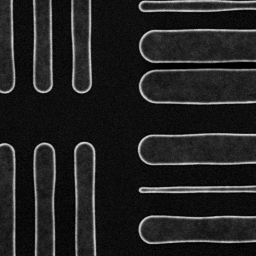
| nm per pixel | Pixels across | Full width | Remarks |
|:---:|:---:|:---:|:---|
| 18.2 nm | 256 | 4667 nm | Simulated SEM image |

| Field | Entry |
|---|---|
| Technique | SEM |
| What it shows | groups of lines, slits or small figures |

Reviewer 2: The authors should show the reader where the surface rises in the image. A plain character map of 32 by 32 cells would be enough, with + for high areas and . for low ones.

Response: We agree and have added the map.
+...++...++.......++++++++++++++
+...++...++.....................
+...++...++.....................
+...++...++.....................
++..++...++.......++++++++++++++
++..++...++.......++++++++++++++
++..++...++.......++++++++++++++
++..++...++.......++++++++++++++
++..++...++.....................
++..++...++.......++++++++++++++
++..++...++.......++++++++++++++
..................++++++++++++++
..................++++++++++++++
................................
................................
................................
................................
..................++++++++++++++
++...++...++.....+++++++++++++++
++..+++..+++......++++++++++++++
++..+++..+++....................
++..+++..+++....................
++..+++..+++....................
++..+++...++.............+++++++
++...++...++....................
++...++...++....................
++...++...++....................
++...++...++......++++++++++++++
++...++...++......++++++++++++++
++...++...++......++++++++++++++
++...++...++....................
++...++...++....................